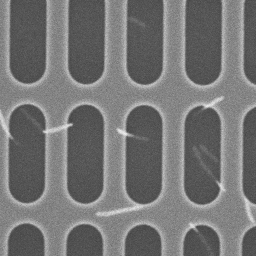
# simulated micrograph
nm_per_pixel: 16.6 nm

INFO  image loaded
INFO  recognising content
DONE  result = groups of lines, slits or small figures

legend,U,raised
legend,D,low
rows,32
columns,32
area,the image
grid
UDDDDDUUUDDDDUUUDDDDUUUDDDDDUUUD
UDDDDDUUDDDDDUUUDDDDDUUDDDDDUUDD
UDDDDDUUDDDDDUUUDDDDUUUDDDDDUUDD
UDDDDDUUDDDDDUUUDDDDUUUDDDDDUUDD
UDDDDDUUDDDDDUUUDDDDUUUDDDDDUUDD
UDDDDDUUDDDDDUUUDDDDUUUDDDDDUUDD
UDDDDDUUDDDDDUUUDDDDUUUDDDDDUUDD
UDDDDDUUDDDDDUUUDDDDUUUDDDDDUUDD
UDDDDDUUUDDDDUUUDDDDUUUDDDDDUUDD
UUDDDUUUUDDDDUUUDDDDUUUDDDDUUUUD
UUUDUUUUUUDUUUUUUDDUUUUUUDUUUUUU
UUUUUUUUUUUUUUUUUUUUUUUUUUUUUUUU
UUUUUUUUUUUUUUUUUUUUUUUUUUUUUUUU
UUDDDUUUUDDDUUUUUDDUUUUUDDUUUUUU
UDDDDDUUUDDDDUUUDDDDUUUDDDDUUUUD
UDDDDDUUUDDDDUUUDDDDUUUDDDDDUUDD
UDDDDDUUDDDDDUUUDDDDUUUDDDDDUUDD
UDDDDDUUDDDDDUUUDDDDUUUDDDDDUUDD
UDDDDDUUDDDDDUUUDDDDUUUDDDDDUUDD
UDDDDDUUDDDDDUUUDDDDUUUDDDDDUUDD
UDDDDDUUDDDDDUUUDDDDUUUDDDDDUUDD
UDDDDDUUDDDDDUUUDDDDUUUDDDDDUUDD
UDDDDDUUDDDDDUUUDDDDUUUDDDDDUUDD
UDDDDDUUDDDDDUUUDDDDUUUDDDDDUUDD
UDDDDUUUUDDDDUUUDDDDUUUDDDDUUUUD
UUUUUUUUUUUUUUUUUUUUUUUUUDUUUUUU
UUUUUUUUUUUUUUUUUUUUUUUUUUUUUUUU
UUUUUUUUUUUUUUUUUUUUUUUUUUUUUUUU
UUDDDUUUUDDDUUUUUDDUUUUUDDUUUUUD
UDDDDUUUDDDDDUUUDDDDUUUDDDDUUUUD
UDDDDDUUDDDDDUUUDDDDUUUDDDDDUUDD
UDDDDDUUDDDDDUUDDDDDUUUDDDDDUUDD